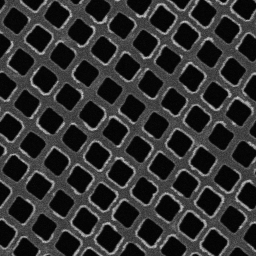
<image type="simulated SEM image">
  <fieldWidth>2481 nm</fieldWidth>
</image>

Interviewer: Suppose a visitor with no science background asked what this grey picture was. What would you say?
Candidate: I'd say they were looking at a regular array of holes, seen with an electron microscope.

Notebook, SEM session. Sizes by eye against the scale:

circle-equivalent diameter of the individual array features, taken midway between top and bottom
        224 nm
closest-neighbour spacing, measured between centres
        282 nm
